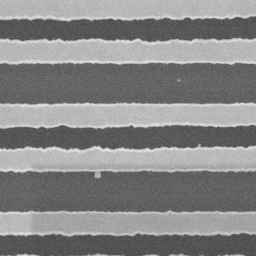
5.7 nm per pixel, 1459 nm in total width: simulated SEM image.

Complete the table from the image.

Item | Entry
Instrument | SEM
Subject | lines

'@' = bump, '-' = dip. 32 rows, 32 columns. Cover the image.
@@@@@@@@@@@@@@@@@@@@@@@@@@@@@@@@
@@@@@@@@@@@@@@@@@@@@@@@@@@@@@@@@
-------@@--@---@----------------
--------------------------------
--------------------------------
@@@@@@@@@@@@@@@@@@@@@@@@@@@@@@@@
@@@@@@@@@@@@@@@@@@@@@@@@@@@@@@@@
@@@@@@@@@@@@@@@@@@@@@@@@@@@@@@@@
--------------------------------
--------------------------------
--------------------------------
--------------------------------
--------------------------------
@@@@@@@@@@@@@@@@@@@@@@@@@@@@@@@@
@@@@@@@@@@@@@@@@@@@@@@@@@@@@@@@@
@@@@@@@@@@@@@@@@@@@@@@@@@@@@@@@@
--------------------------------
--------------------------------
---@@@@@---@@-------@@@@@@@@@@@@
@@@@@@@@@@@@@@@@@@@@@@@@@@@@@@@@
@@@@@@@@@@@@@@@@@@@@@@@@@@@@@@@@
--------------------------------
--------------------------------
--------------------------------
--------------------------------
--------------------------------
-------@---@---------@----------
@@@@@@@@@@@@@@@@@@@@@@@@@@@@@@@@
@@@@@@@@@@@@@@@@@@@@@@@@@@@@@@@@
--------@-----------------------
--------------------------------
--------------------------------